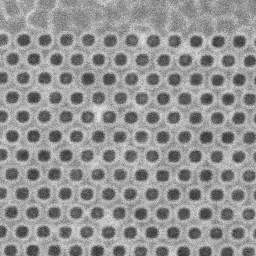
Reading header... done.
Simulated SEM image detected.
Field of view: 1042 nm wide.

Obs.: a regular array of holes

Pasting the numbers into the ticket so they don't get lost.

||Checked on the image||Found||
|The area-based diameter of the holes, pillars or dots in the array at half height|57.2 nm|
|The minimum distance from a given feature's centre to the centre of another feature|86.8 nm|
